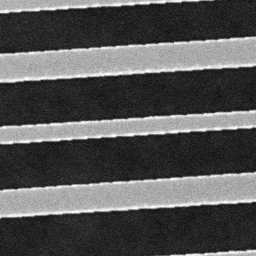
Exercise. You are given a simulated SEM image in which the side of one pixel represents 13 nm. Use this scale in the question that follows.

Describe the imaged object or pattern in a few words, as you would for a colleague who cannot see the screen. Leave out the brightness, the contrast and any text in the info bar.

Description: lines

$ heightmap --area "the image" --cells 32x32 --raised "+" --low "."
+++++++++++++++++...............
+...............................
................................
................................
................................
...................+++++++++++++
.....+++++++++++++++++++++++++++
++++++++++++++++++++++++++++++++
++++++++++++++++++++++++++......
++++++++++......................
................................
................................
................................
................................
.....................+++++++++++
......++++++++++++++++++++++++++
++++++++++++++++++++++..........
+++++++.........................
................................
................................
................................
................................
...................+++++++++++++
.....+++++++++++++++++++++++++++
++++++++++++++++++++++++++++++++
+++++++++++++++++++++++++.......
+++++++++.......................
................................
................................
................................
................................
.............................+++